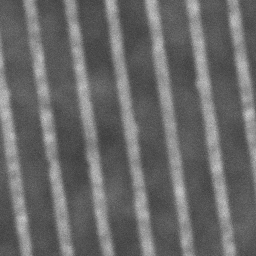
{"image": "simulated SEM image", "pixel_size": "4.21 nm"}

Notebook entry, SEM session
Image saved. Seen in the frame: parallel lines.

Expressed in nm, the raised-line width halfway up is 39.1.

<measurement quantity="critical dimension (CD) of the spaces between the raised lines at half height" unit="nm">132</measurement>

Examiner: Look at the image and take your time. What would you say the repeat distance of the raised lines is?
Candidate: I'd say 169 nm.